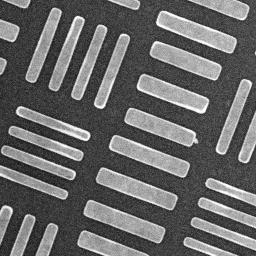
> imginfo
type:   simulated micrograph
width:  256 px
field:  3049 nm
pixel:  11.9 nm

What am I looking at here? groups of lines, slits or small figures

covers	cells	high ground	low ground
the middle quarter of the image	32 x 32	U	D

UDDDDUUDDDDUUUDDDDDDDDDDDDDDUUUU
UDDDUUUDDDDUUUDDDDDDDDDDDDDDDDDU
DDDDUUUDDDUUUDDDDDDDDDDDDDDDDDDD
DDDUUUDDDDUUUDDDDDDUUUUDDDDDDDDD
DDDUUUDDDDUUDDDDDDDUUUUUUDDDDDDD
DDDUUDDDDUUUDDDDDDUUUUUUUUUUDDDD
DDUUUDDDDUUDDDDDDDDUUUUUUUUUUUUD
DDUUUDDDUUUDDDDDDDDDDDUUUUUUUUUU
DDUUDDDDUUUDDDDDDDDDDDDDUUUUUUUU
DDDDDDDDUUDDDDDDDDDDDDDDDDDUUUUU
DDDDDDDDUUDDDDDDDDDDDDDDDDDDDDUU
DDDDDDDDDDDDDDDDUUUDDDDDDDDDDDDD
DDDDDDDDDDDDDDDDUUUUUDDDDDDDDDDD
DDDDDDDDDDDDDDDUUUUUUUUUDDDDDDDD
DDDDDDDDDDDDDDDUUUUUUUUUUUDDDDDD
UUDDDDDDDDDDDDDDDDUUUUUUUUUUUDDD
UUUUDDDDDDDDDDDDDDDDUUUUUUUUUUUD
DUUUUUDDDDDDDDDDDDDDDDDUUUUUUUUU
DDDDUUDDDDDDUUUDDDDDDDDDDUUUUUUU
DDDDDDDDDDDDUUUUUUDDDDDDDDDDUUUU
UDDDDDDDDDDDUUUUUUUUDDDDDDDDDDDD
UUUDDDDDDDDDUUUUUUUUUUDDDDDDDDDD
UUUUUDDDDDDDDDUUUUUUUUUUUDDDDDDD
DDUUUDDDDDDDDDDDDUUUUUUUUUUUDDDD
DDDDDDDDDDDDDDDDDDDDUUUUUUUUUUUD
DDDDDDDDDDDDDDDDDDDDDDUUUUUUUUUD
UDDDDDDDDUUDDDDDDDDDDDDDDUUUUUUD
UUUDDDDDDUUUUDDDDDDDDDDDDDDUUUUD
DUDDDDDDUUUUUUUUUDDDDDDDDDDDDDDD
DDDDDDDDDUUUUUUUUUUDDDDDDDDDDDDD
DDDDDDDDDDUUUUUUUUUUUUDDDDDDDDDD
DDDDDDDDDDDDDUUUUUUUUUUUDDDDDDDD